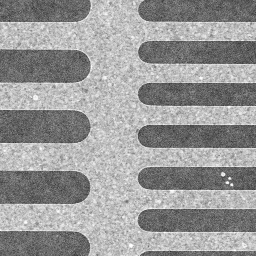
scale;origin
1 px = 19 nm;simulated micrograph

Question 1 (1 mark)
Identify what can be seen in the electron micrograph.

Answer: groups of lines, slits or small figures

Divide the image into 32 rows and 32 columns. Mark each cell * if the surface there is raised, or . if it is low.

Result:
...........******...............
...........******...............
..........********..............
********************************
********************************
******************..............
..........*******...............
...........*******..............
...........*********************
...........*********************
******************..............
*****************...............
*****************...............
********************************
...........*********************
...........***********.*********
...........******...............
..........*******...............
*******************.............
********************************
********************************
..........*******...............
...........******...............
...........*******..............
...........*********************
.........***********************
******************..............
*****************...............
******************..............
...........*********************
...........*********************
...........*******..............